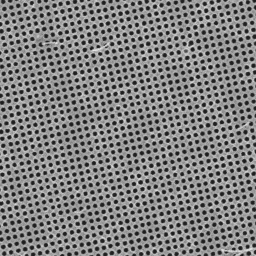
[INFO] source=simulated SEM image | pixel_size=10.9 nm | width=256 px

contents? a regular array of holes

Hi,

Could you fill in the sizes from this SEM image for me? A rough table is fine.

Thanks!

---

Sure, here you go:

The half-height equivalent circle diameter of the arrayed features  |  49.2 nm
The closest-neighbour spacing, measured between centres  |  72.7 nm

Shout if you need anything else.